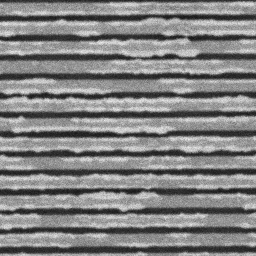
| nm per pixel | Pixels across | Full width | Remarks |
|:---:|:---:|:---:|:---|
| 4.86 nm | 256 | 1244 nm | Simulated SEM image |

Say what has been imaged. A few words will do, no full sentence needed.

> parallel lines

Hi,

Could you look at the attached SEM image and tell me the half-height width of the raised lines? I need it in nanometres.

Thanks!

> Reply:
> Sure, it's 62.6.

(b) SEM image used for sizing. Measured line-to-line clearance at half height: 29.2 nanometres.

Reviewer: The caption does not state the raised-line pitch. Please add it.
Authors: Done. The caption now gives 19.3 pixels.